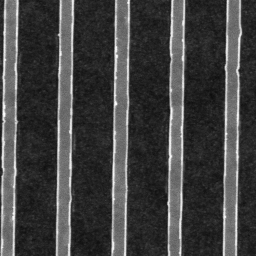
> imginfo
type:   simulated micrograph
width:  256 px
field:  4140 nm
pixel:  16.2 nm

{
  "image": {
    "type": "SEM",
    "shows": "parallel lines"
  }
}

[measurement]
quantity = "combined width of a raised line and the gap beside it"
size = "899 nm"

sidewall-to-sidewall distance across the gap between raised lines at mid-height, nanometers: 691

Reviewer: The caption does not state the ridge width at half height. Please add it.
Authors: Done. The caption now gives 204 nm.